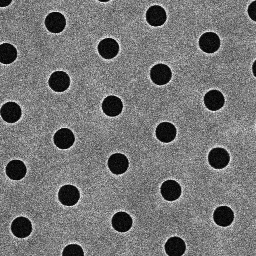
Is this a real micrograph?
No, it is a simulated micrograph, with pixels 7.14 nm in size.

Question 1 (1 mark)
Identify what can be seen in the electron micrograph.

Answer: a regular array of holes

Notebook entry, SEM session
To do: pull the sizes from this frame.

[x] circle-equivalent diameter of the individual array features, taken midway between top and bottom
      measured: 150 nanometres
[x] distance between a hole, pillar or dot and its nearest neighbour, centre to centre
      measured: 57.7 pixels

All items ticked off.